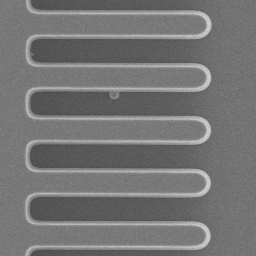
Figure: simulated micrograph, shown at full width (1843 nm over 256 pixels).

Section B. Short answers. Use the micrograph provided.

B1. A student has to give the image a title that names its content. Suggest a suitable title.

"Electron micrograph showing groups of lines, slits or small figures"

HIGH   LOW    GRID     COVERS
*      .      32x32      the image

****............................
****************................
**************************......
**************************......
*************************.......
****............................
****............................
****............................
*************************.......
**************************......
**************************......
****............................
****............................
****............................
****............................
**************************......
**************************......
*************************.......
****............................
***.............................
****............................
*************************.......
**************************......
**************************......
****............................
****............................
****............................
****............................
**************************......
**************************......
**************************......
****............................